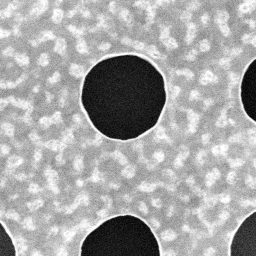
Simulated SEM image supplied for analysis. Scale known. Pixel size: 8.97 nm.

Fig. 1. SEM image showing holes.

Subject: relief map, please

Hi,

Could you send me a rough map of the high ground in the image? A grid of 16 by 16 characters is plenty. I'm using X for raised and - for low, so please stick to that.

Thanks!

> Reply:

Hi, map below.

XXXXXXXXXXXXXXXX
XXXXXXXXXXXXXXXX
XXXXXXXXXXXXXXXX
XXXXXXX--XXXXXXX
XXXXXX----XXXXX-
XXXXX-----XXXXX-
XXXXX-----XXXXX-
XXXXXX----XXXXXX
XXXXXXX--XXXXXXX
XXXXXXXXXXXXXXXX
XXXXXXXXXXXXXXXX
XXXXXXXXXXXXXXXX
XXXXXXXXXXXXXXXX
XXXXXXXXXXXXXXXX
XXXXXX----XXXXX-
-XXXX-----XXXX--